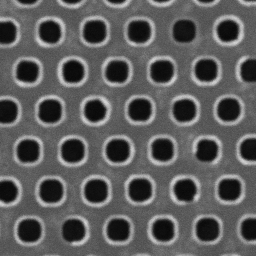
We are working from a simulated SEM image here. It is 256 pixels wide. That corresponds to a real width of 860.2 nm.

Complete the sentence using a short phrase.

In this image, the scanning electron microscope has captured a regular array of holes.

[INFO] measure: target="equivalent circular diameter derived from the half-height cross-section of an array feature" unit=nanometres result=80.4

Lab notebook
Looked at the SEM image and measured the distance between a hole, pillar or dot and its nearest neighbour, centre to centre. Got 0.149 µm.